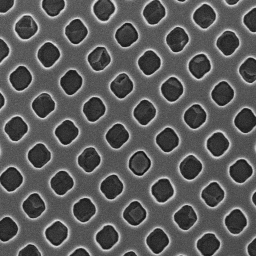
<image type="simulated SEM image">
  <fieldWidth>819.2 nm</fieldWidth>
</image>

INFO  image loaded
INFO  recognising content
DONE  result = a regular array of holes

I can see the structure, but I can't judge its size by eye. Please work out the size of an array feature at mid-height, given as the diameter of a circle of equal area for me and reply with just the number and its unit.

73.4 nanometres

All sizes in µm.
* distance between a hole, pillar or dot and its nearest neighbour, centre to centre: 0.113